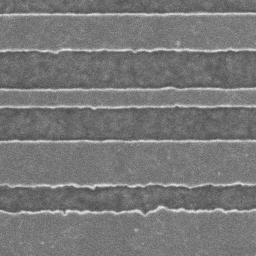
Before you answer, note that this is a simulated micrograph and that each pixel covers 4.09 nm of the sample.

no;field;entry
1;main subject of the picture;one or a few lines or trenches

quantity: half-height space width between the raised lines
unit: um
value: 0.139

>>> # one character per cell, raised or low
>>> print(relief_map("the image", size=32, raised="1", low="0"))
00000000000000000000000000000000
00000000000000000000000000000000
11111111111111111111111111111111
11111111111111111111111111111111
11111111111111111111111111111111
11111111111111111111111111111111
00000000000000000000000000000000
00000000000000000000000000000000
00000000000000000000000000000000
00000000000000000000000000000000
00000000000000000000000000000000
11111111111111111111111111111111
11111111111111111111111111111111
00000000000100000000000000000000
00000000000000000000000000000000
00000000000000000000000000000000
00000000000000000000000000000000
00000000000000000000000000000000
11111111111111111111111111111111
11111111111111111111111111111111
11111111111111111111111111111111
11111111111111111111111111111111
11111111111111111111111111111111
00000000000000000000000000000000
00000000000000000000000000000000
00000000000000000000000000000000
10010111010101001001111111111111
11111111111111111111111111111111
11111111111111111111111111111111
11111111111111111111111111111111
11111111111111111111111111111111
11111111111111111111111111111111